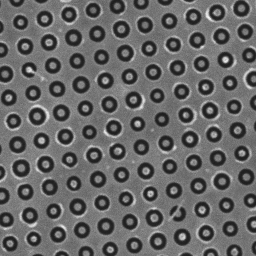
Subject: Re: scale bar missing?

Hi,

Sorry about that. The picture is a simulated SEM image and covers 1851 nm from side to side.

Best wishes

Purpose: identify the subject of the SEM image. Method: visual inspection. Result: a regular array of ring-shaped grooves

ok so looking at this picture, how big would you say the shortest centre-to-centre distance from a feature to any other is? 171 nanometers